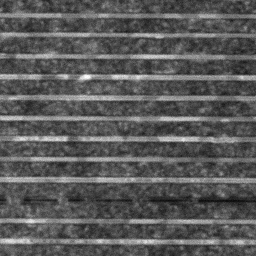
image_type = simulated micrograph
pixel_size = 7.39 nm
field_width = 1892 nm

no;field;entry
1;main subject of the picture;parallel lines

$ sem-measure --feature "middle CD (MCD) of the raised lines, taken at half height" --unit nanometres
25.9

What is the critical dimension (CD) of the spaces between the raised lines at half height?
122 nanometres